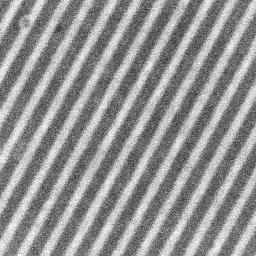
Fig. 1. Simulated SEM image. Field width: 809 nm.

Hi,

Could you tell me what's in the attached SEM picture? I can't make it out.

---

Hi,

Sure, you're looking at parallel lines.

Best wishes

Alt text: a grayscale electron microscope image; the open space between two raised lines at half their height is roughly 0.0516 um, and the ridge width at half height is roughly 15.9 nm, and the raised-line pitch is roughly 66.2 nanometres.